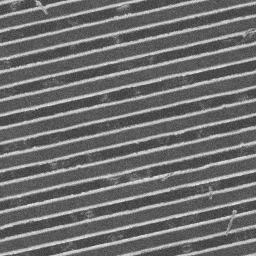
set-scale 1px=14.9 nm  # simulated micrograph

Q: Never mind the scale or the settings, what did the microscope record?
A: parallel lines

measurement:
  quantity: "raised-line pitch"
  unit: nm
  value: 408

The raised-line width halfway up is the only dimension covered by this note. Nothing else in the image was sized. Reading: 0.197 microns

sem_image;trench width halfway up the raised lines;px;14.2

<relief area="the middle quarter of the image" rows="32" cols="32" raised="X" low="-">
---------XXXXXXXXXXXXX----------
----XXXXXXXXXXXXXX--------------
XXXXXXXXXXXXX-----------------XX
XXXXXXXXX-----------------XXXXXX
XXXX-----------------XXXXXXXXXXX
-----------------XXXXXXXXXXXXXX-
------------XXXXXXXXXXXXXXX-----
--------XXXXXXXXXXXXXX----------
---XXXXXXXXXXXXXXX--------------
XXXXXXXXXXXXX-----------------XX
XXXXXXXXX-----------------XXXXXX
XXXXX----------------XXXXXXXXXXX
-----------------XXXXXXXXXXXXXXX
-------------XXXXXXXXXXXXXX-----
--------XXXXXXXXXXXXXXX---------
---XXXXXXXXXXXXXXX--------------
XXXXXXXXXXXXXX-----------------X
XXXXXXXXX------------------XXXXX
XXXXX----------------XXXXXXXXXXX
-----------------XXXXXXXXXXXXXXX
-------------XXXXXXXXXXXXXX-----
--------XXXXXXXXXXXXXXX---------
----XXXXXXXXXXXXXX--------------
XXXXXXXXXXXXXX-----------------X
XXXXXXXXX------------------XXXXX
XXXXX----------------XXXXXXXXXXX
------------------XXXXXXXXXXXXXX
-------------XXXXXXXXXXXXXX-----
---------XXXXXXXXXXXXXX---------
----XXXXXXXXXXXXXX--------------
XXXXXXXXXXXXXX----------------XX
XXXXXXXXX-----------------XXXXXX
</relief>